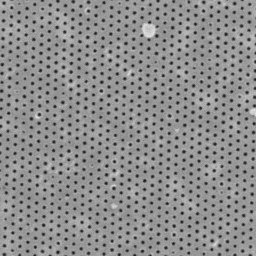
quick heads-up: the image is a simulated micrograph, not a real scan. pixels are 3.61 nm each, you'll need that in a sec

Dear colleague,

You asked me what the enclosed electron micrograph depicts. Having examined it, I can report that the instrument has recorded a regular array of holes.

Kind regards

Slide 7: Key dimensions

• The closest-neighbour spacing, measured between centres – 30.7 nanometres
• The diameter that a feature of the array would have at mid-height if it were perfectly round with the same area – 11.5 nanometres